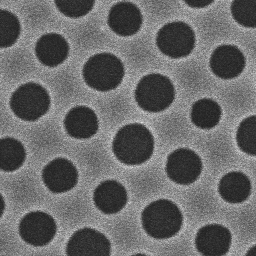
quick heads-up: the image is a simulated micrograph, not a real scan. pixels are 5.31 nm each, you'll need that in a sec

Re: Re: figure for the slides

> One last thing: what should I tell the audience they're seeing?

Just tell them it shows a regular array of holes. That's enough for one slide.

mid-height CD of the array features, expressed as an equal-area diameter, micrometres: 0.197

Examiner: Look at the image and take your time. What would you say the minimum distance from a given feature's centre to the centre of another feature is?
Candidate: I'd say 293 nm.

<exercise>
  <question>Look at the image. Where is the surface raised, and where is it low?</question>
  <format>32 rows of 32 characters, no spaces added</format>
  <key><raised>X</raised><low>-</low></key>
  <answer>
XXXXXXX-----XX---XXXXXX---XXX---
-XXXXXX----XXX----XXXXXXXXXXX---
--XXXXXXXXXXX-----XXXXXXXXXXX---
---XXXXXXXXXXX----XX----XXXXXXX-
--XXX---XXXXXXX-XXXX----XXXXXXXX
--XX-----XXXXXXXXXX-----XXXXXXXX
XXXX-----XXXXXXXXXXX----XXX---XX
XXXXX---XXX----XXXXXXXXXXX-----X
XXXXXXXXXX------XXXXXXXXXX-----X
XXXXXXXXXX-----XXX---XXXXXX---XX
XXX--XXXXXX----XX-----XXXXXXXXXX
XX----XXXXXXXXXXX-----XXXXXXXXXX
X-----XXXXXXXXXXX-----XXX--XXXXX
X-----XXX--XXXXXXX---XXX----XXXX
XX---XXX----XXXXXXXXXXXX----XXX-
XXXXXXXX----XXXX--XXXXXX---XXX--
XXXXXXXX----XXX----XXXXXXXXXXX--
--XXXXXXXXXXXX-----XXXXXXXXXX---
---XXXXXXXXXXX-----XXX-XXXXXXX--
---XXXXXXXXXXX-----XX----XXXXXX-
---XXX---XXXXXX---XXX----XXXXXXX
XXXXX-----XXXXXXXXXXX----XXXX-XX
XXXXX-----XXX-XXXXXXX----XX----X
XXXXXX---XXX----XXXXXXXXXXX----X
XXXXXXXXXXXX----XXXXXXXXXXXX---X
-XXXXXXXXXXX----XXX---XXXXXXXXXX
XXXX--XXXXXXX--XXX-----XXXXXXXXX
XXX----XXXXXXXXXXX-----XXXXXXXXX
XX-----XXX--XXXXXX-----XX---XXXX
XX-----XX----XXXXXX---XX-----XXX
XXX---XX------XXXXXXXXXX-----XXX
XXXXXXXX------XXXXXXXXXXX---XXX-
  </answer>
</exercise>